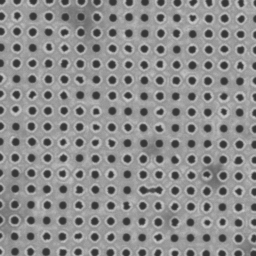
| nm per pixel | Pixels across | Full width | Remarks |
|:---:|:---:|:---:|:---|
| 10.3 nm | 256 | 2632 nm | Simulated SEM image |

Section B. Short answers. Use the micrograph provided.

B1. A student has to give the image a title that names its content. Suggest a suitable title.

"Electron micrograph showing a regular array of holes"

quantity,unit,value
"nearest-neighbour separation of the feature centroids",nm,158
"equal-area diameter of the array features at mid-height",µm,0.082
